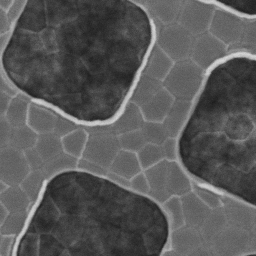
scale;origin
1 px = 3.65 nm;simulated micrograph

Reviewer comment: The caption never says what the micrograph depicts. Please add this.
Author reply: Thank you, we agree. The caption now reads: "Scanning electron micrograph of holes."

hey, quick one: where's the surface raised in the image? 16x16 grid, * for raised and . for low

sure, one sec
**.......*****..
*........*******
*........*******
.........*******
.........****...
*.......*****...
***.....****....
*****.******....
***********.....
***********.....
************....
***....******...
***......******.
**........******
**.........*****
*.........******